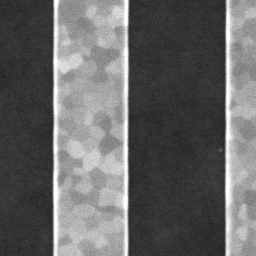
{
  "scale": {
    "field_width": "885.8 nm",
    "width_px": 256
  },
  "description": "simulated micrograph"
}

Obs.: wiring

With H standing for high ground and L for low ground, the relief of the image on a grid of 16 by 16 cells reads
LLLHHHHHLLLLLLHH
LLLHHHHHLLLLLLHH
LLLHHHHHLLLLLLHH
LLLHHHHHLLLLLLHH
LLLHHHHHLLLLLLHH
LLLHHHHHLLLLLLHH
LLLHHHHHLLLLLLHH
LLLHHHHHLLLLLLHH
LLLHHHHHLLLLLLHH
LLLHHHHHLLLLLLHH
LLLHHHHHLLLLLLHH
LLLHHHHHLLLLLLHH
LLLHHHHHLLLLLLHH
LLLHHHHHLLLLLLHH
LLLHHHHHLLLLLLHH
LLLHHHHHLLLLLLHH